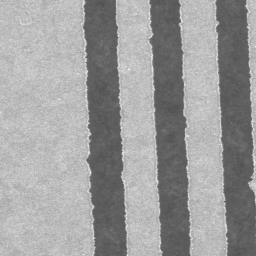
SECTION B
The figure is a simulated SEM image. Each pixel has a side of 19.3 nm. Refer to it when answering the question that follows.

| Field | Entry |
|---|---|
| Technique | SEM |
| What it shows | one or a few lines or trenches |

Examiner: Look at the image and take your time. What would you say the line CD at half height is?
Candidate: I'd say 662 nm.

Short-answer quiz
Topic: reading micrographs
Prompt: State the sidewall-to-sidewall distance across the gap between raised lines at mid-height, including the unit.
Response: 0.609 µm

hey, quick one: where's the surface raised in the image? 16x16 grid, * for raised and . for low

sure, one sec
*****..**..**..*
*****..**..***..
*****..**..***..
*****..***.***..
*****..***.***..
*****..***..**..
*****...**..**..
******..**..**..
******..**..**..
******..**..**..
******..**..**..
******..**..**..
******..**..**..
******..**..**..
******..**..**..
******..**..**..